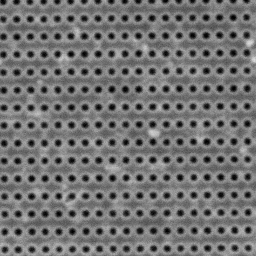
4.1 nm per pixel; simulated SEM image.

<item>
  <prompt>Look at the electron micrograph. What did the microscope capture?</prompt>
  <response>a regular array of holes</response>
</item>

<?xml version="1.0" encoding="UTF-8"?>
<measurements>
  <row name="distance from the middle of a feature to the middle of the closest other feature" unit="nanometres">54.9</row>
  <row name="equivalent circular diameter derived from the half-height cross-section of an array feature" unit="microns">0.0327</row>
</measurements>